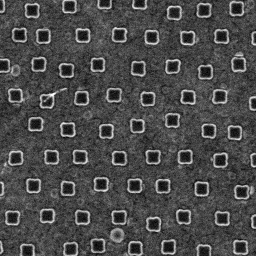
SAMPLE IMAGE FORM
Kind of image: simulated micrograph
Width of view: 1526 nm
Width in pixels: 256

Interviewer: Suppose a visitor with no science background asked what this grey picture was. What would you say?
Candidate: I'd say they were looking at a regular array of raised bodies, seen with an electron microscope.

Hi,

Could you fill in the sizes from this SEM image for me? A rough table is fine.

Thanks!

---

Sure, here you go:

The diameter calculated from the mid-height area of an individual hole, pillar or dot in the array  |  15.2 px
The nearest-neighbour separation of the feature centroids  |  29.9 pixels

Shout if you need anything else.